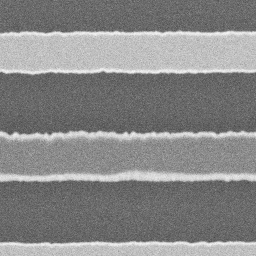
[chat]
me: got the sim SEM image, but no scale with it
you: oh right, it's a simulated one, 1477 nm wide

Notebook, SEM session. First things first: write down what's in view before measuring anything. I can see lines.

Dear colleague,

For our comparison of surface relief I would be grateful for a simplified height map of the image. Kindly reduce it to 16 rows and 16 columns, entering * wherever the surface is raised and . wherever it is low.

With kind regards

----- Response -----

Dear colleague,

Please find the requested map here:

................
................
****************
****************
****************
................
................
................
****************
****************
****************
................
................
................
................
****************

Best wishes